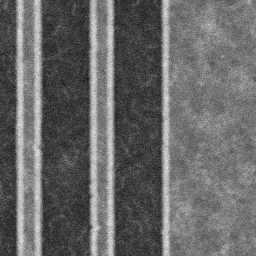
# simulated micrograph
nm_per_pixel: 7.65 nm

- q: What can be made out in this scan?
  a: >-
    one or a few lines or trenches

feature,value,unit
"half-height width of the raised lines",133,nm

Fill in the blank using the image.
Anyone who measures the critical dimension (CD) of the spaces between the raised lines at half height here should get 427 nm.